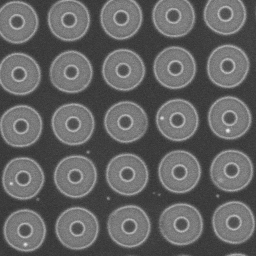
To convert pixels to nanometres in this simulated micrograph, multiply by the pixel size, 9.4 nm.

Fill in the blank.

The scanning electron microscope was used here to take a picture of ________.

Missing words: an array of small figures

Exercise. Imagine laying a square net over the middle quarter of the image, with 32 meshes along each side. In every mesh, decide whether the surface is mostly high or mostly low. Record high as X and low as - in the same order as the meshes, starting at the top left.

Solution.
-XX---XXXX---XXX----XXX---XXXX--
XXX----XXX---XXXX---XXX---XXXX--
XXX----XXX---XXX----XXX----XX---
-XX----XXX---------XXXX---------
------XXXXX--------XXXXX-------X
-----XXXXXXX------XXXXXXXX----XX
----XXXXXXXXXXXXXXXXXXXXXXXXXXXX
XXXXXXXXXXXXXXXXXXXXXXXXXXXXXXXX
XXXXXXXXXXXXXXXXXXXXXXXXXXXXXXXX
XXXXXXXXXXXXXXXXXXXXXXXXXX----XX
----XXXXXXXXX-----XXXXXXX-------
------XXXXXX-------XXXXX--------
-------XXXX---------XXXX---XX---
-XX----XXXX---XXX----XX----XXX--
-XXX---XXX----XXX----XX----XXX--
-XXX---XXXX---XXX---XXXX---XXX--
-XX----XXXX---------XXXX--------
-------XXXXX--------XXXXX-------
------XXXXXXX-----XXXXXXXX----XX
-----XXXXXXXXXXXXXXXXXXXXXXXXXXX
XXXXXXXXXXXXXXXXXXXXXXXXXXXXXXXX
XXXXXXXXXXXXXXXXXXXXXXXXXXXXXXXX
XXXXXXXXXXXXXXXXXXXXXXXXXX-----X
X----XXXXXXXX-----XXXXXXX-------
------XXXXXX-------XXXXXX-------
-------XXXX---------XXXX----XX--
--X-----XXX---XXX---XXXX---XXXX-
-XXX----XXX---XXXX---XXX---XXXX-
-XXX----XXX---XXX----XXX----XX--
--XX----XXX---------XXXXX-------
-------XXXXX--------XXXXX-------
------XXXXXXX------XXXXXXXX----X